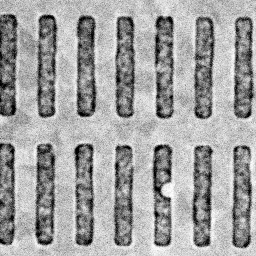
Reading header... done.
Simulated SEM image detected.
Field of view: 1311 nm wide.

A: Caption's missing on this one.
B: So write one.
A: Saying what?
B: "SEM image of a regular array of holes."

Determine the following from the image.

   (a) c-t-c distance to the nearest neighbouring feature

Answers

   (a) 201 nm